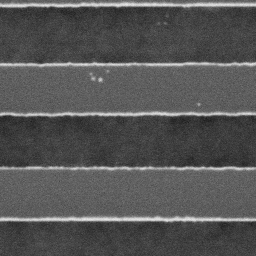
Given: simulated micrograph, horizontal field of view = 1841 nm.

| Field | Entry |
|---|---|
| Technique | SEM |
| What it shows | lines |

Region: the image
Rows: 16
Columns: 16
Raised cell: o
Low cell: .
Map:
................
................
................
................
oooooooooooooooo
oooooooooooooooo
oooooooooooooooo
................
................
................
.o..............
oooooooooooooooo
oooooooooooooooo
oooooooooooooooo
................
................